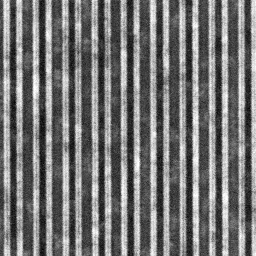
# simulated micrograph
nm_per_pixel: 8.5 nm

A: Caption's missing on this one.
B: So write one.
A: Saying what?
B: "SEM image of parallel lines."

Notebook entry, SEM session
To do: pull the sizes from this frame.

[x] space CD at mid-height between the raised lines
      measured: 0.0786 µm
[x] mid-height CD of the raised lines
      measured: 31.9 nm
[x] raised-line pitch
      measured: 125 nanometers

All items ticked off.